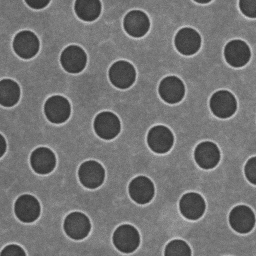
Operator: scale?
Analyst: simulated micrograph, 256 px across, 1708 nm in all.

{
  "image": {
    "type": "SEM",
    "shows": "a regular array of holes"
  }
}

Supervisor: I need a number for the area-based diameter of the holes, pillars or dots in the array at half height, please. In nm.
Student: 194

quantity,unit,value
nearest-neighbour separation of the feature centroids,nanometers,339